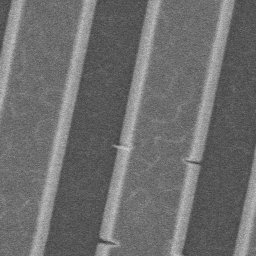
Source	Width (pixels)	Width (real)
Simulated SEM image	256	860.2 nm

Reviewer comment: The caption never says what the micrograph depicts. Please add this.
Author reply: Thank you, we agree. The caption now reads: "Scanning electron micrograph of one or a few lines or trenches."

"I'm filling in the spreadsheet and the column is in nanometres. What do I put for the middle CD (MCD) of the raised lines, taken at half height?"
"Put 246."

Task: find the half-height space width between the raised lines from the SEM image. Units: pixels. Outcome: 61.3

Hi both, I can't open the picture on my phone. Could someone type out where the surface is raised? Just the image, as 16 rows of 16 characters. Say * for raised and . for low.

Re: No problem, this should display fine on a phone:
.*****...*****..
.****....*****..
.****....*****..
*****....*****..
*****....****...
*****....****...
****....*****...
****....*****...
****....*****...
****....****....
***....*****....
***....*****....
***....*****....
***....*****...*
***....****....*
**....*****....*